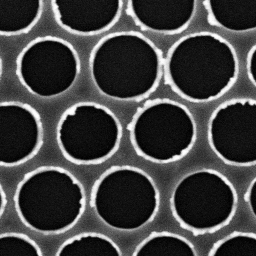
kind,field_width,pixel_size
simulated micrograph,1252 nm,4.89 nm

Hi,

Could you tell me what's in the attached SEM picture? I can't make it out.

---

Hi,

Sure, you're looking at a regular array of holes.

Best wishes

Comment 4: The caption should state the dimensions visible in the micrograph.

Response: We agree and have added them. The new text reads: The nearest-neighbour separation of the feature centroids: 0.369 micrometres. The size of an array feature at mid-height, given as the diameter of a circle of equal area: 59.3 pixels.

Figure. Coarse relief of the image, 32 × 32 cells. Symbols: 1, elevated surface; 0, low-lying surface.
00000110000000010000000011000000
00000110000000011000000011100000
00001111000000111000000011100000
00011111100001111110001111110000
11111111111111100111111110111111
11110000111110000001110000001111
11100000011100000001110000000111
11100000001100000000100000000110
11100000001100000000100000000110
11100000011100000000100000000111
11100000011100000001110000001111
11110000111110000011111000011111
11111111111111111111111111111111
00011111110011111110000111110000
00001111100000111000000011100000
00000111000000011000000011100000
00000110000000011000000011000000
00000111000000011000000011000000
00001111000000111000000111100000
00001111100001111110001111110000
11111111111111111111111111111111
11111000111111000111111110111111
11100000011110000001111000001111
11100000001100000001110000000110
11000000001100000001110000000110
11000000001100000001110000000110
11100000001100000001110000000111
11100000011110000011111000001111
11110000111111100111111100111111
11111111111111111111011111111101
00001111100000111100000111110000
00000111000000011000000011100000